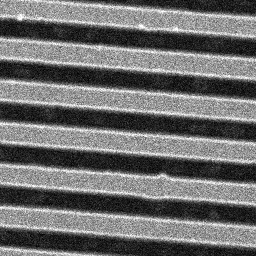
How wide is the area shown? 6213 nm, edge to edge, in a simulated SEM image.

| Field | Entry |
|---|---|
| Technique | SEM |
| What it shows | parallel lines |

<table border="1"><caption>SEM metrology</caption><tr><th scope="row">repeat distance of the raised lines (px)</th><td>41.7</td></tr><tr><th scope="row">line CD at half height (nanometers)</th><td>550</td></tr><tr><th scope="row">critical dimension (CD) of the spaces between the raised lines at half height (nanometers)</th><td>469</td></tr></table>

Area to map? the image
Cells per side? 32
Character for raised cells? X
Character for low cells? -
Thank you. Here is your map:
XXXXXXXXXXXXX-------------------
XXXXXXXXXXXXXXXXXXXXXXXX--------
--XXXXXXXXXXXXXXXXXXXXXXXXXXXXXX
---------------XXXXXXXXXXXXXXXXX
----------------------------XXXX
XXXXXXXXXX----------------------
XXXXXXXXXXXXXXXXXXXXXXX---------
-XXXXXXXXXXXXXXXXXXXXXXXXXXXXXXX
-------------XXXXXXXXXXXXXXXXXXX
-------------------------XXXXXXX
XXXXXXX-------------------------
XXXXXXXXXXXXXXXXXXXX------------
XXXXXXXXXXXXXXXXXXXXXXXXXXXXXXXX
----------XXXXXXXXXXXXXXXXXXXXXX
----------------------XXXXXXXXXX
XXXX----------------------------
XXXXXXXXXXXXXXXX----------------
XXXXXXXXXXXXXXXXXXXXXXXXXXXX----
------XXXXXXXXXXXXXXXXXXXXXXXXXX
--------------------XXXXXXXXXXXX
X-------------------------------
XXXXXXXXXXXXXX------------------
XXXXXXXXXXXXXXXXXXXXXXXXXX------
----XXXXXXXXXXXXXXXXXXXXXXXXXXXX
-----------------XXXXXXXXXXXXXXX
-----------------------------XXX
XXXXXXXXXXX---------------------
XXXXXXXXXXXXXXXXXXXXXXX---------
--XXXXXXXXXXXXXXXXXXXXXXXXXXXXXX
-------------XXXXXXXXXXXXXXXXXXX
-------------------------XXXXXXX
XXXXXXXX------------------------